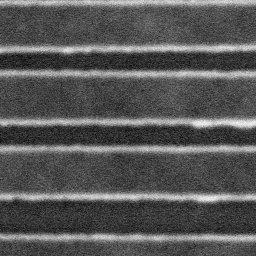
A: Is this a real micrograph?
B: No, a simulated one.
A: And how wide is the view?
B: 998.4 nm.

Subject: lines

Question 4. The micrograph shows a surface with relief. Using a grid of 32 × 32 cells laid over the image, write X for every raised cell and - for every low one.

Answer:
XXXXXXXXXXXXXXXXXXXXXXXXXXXXXXXX
XXXXXXXXXXXXXXXXXXXXXXXXXXXXXXXX
XXXXXXXXXXXXXXXXXXXXXXXXXXXXXXXX
XXXXXXXXXXXXXXXXXXXXXXXXXXXXXXXX
XXXXXXXXXXXXXXXXXXXXXXXXXXXXXXXX
XXXXXXXXXXXXXXXXXXXXXXXXXXXXXXXX
--------------------------------
--------------------------------
--------------------------------
XXXXXXXXXXXXXXXXXXXXXXXXXXXXXXXX
XXXXXXXXXXXXXXXXXXXXXXXXXXXXXXXX
XXXXXXXXXXXXXXXXXXXXXXXXXXXXXXXX
XXXXXXXXXXXXXXXXXXXXXXXXXXXXXXXX
XXXXXXXXXXXXXXXXXXXXXXXXXXXXXXXX
XXXXXXXXXXXXXXXXXXXXXXXXXXXXXXXX
X-------------------------------
--------------------------------
--------------------------------
XXXXXXXXXXXXXXXXXXXXXXXXXXXXXXXX
XXXXXXXXXXXXXXXXXXXXXXXXXXXXXXXX
XXXXXXXXXXXXXXXXXXXXXXXXXXXXXXXX
XXXXXXXXXXXXXXXXXXXXXXXXXXXXXXXX
XXXXXXXXXXXXXXXXXXXXXXXXXXXXXXXX
XXXXXXXXXXXXXXXXXXXXXXXXXXXXXXXX
XXXXXXXXXXXXXXXXXXXXXXXXXXXXXXXX
--------------------------------
--------------------------------
--------------------------------
--------------------------------
XXXXXXXXXXXXXXX-XX-----X-XX-----
XXXXXXXXXXXXXXXXXXXXXXXXXXXXXXXX
XXXXXXXXXXXXXXXXXXXXXXXXXXXXXXXX